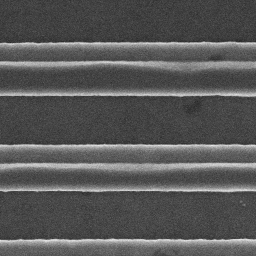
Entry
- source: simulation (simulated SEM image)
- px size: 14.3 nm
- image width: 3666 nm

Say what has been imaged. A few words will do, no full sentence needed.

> lines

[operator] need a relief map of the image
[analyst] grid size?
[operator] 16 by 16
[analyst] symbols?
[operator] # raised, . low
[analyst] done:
................
................
................
################
################
################
................
................
................
################
################
################
................
................
................
################